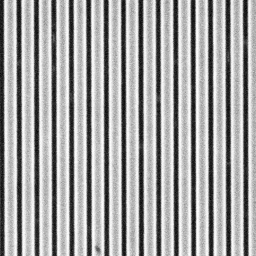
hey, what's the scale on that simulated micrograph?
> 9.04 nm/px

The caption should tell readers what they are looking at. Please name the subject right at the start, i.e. parallel lines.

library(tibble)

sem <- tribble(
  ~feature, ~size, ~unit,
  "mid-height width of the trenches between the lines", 48.6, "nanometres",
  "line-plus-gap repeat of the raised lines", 157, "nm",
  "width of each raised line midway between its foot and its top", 0.103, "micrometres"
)